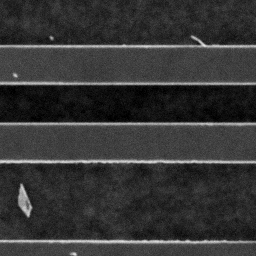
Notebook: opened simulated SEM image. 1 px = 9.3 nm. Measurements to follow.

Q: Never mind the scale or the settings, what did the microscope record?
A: lines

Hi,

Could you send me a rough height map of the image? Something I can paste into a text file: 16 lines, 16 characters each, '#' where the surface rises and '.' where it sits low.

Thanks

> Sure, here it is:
................
................
................
################
################
................
................
................
################
################
................
................
................
................
................
################